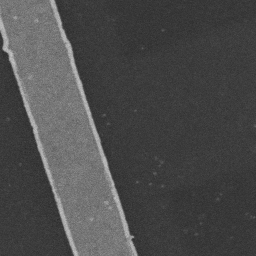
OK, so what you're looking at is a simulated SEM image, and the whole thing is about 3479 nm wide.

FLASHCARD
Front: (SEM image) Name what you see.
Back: one or a few lines or trenches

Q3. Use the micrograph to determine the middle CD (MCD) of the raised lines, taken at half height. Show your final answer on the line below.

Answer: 763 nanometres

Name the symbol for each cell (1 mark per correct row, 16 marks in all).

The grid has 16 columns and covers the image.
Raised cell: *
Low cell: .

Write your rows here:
***.............
****............
****............
.***............
.****...........
.****...........
..***...........
..****..........
..****..........
...***..........
...****.........
...****.........
....***.........
....****........
....****........
.....***........